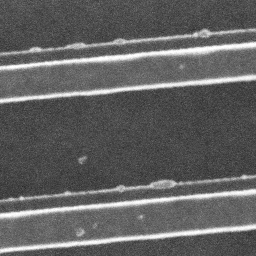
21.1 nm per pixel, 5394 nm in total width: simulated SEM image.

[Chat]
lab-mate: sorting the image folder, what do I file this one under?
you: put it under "lines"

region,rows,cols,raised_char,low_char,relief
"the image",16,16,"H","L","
LLLLLLLLLLLLLLLL
LLLLLLLLLLLLLLLL
LLLLLLLLLLLLLLLL
LLLLLLLHHHHHHHHH
HHHHHHHHHHHHHHHH
HHHHHHHHHLLLLLLL
LLLLLLLLLLLLLLLL
LLLLLLLLLLLLLLLL
LLLLLLLLLLLLLLLL
LLLLLLLLLLLLLLLL
LLLLLLLLLLLLLLLL
LLLLLLLLLLLLLLLL
LLLLLLLLLHHHHHHH
HHHHHHHHHHHHHHHH
HHHHHHHHHHHHHLLL
HHLLLLLLLLLLLLLL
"